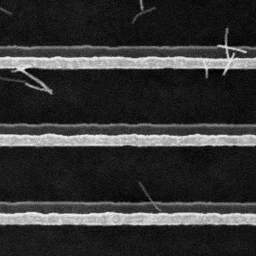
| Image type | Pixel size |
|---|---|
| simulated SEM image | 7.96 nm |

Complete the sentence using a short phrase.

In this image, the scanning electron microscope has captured lines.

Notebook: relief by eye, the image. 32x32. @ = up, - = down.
--------------------------------
--------------------------------
--------------------------------
--------------------------------
--------------------------------
--------------------------------
@@@@@@@@@@@@@@@@@@@@@@@@@@@@@@@@
@@@@@@@@@@@@@@@@@@@@@@@@@@@@@@@@
--@-----@@---------------@--@-@-
--------------------------------
--------------------------------
--------------------------------
--------------------------------
--------------------------------
--------------------------------
--------------------------------
@@@@@@@@@@@@@@@@@@@@@@@@@@@@@@@@
@@@@@@@@@@@@@@@@@@@@@@@@@@@@@@@@
--------------------------------
--------------------------------
--------------------------------
--------------------------------
--------------------------------
--------------------------------
--------------------------------
@@@@@@@@@@@@@@@@@@@@-@@-@@@-----
@@@@@@@@@@@@@@@@@@@@@@@@@@@@@@@@
@@@@@@@@@@@@@@@@@@@@@@@@@@@@@@@@
--------------------------------
--------------------------------
--------------------------------
--------------------------------